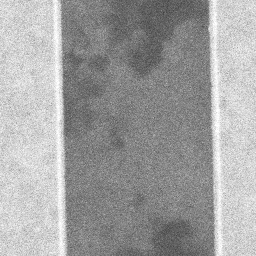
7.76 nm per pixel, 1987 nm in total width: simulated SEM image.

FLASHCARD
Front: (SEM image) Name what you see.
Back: one or a few lines or trenches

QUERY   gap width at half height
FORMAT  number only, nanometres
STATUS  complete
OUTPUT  1240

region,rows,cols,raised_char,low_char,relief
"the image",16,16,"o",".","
ooo..........ooo
ooo..........ooo
ooo..........ooo
oooo.........ooo
oooo..........oo
oooo..........oo
oooo..........oo
oooo..........oo
oooo..........oo
oooo..........oo
oooo..........oo
oooo..........oo
oooo..........oo
oooo..........oo
oooo..........oo
oooo..........oo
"